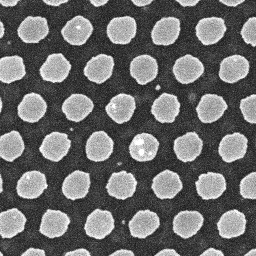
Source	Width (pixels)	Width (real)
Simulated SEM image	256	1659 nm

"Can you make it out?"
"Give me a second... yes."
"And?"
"a regular array of raised bodies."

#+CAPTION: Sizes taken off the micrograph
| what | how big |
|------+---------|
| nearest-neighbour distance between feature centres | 285 nm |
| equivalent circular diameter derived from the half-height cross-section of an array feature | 184 nanometers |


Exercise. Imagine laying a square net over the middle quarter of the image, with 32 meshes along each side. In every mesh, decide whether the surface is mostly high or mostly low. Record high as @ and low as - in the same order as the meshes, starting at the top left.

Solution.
@@----@@@@@@-----@@@@@@----@@@@@
@----@@@@@@@-----@@@@@@----@@@@@
@----@@@@@@@-----@@@@@@-----@@@@
------@@@@@-------@@@@@-----@@@@
--------@@--------@@@--------@@@
--------------------------------
--------------------------------
-------------------------@-----@
-@@@@@------@@@@@-@-@---@@@@---@
@@@@@@@-----@@@@@@@----@@@@@@---
@@@@@@@----@@@@@@@----@@@@@@@---
@@@@@@@----@@@@@@@----@@@@@@@---
@@@@@@-----@@@@@@-----@@@@@@----
-@@@@-------@@@@-------@@@@@----
-------------@@---------@-@-----
--------------------------------
--------------------------------
-------@@@---------@-----------@
@-----@@@@@-------@@@@@-----@@@@
@-----@@@@@@-----@@@@@@-----@@@@
@-----@@@@@@-----@@@@@@@----@@@@
@-----@@@@@@-----@@@@@@-----@@@@
@-----@@@@@@-----@@@@@@-----@@@@
------@@@@@------@@@@@-------@@@
--------------------------------
--------------------------------
--------------------------------
--@@@@------@@@@@-------@@@@----
-@@@@@------@@@@@@-----@@@@@@---
@@@@@@-----@@@@@@@----@@@@@@@---
@@@@@@-----@@@@@@@----@@@@@@@---
@@@@@@-----@@@@@@@----@@@@@@@---